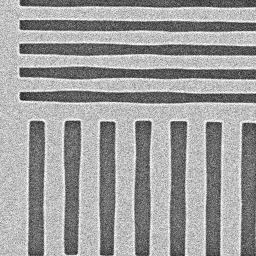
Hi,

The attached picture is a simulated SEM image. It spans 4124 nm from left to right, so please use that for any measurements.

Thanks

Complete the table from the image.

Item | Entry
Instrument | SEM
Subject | groups of lines, slits or small figures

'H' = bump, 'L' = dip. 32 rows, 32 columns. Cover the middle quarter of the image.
HHHHHHHHHHHHHHHHHHHHHHHHHHHHHHHH
LLLLLLLLLLLLLLLLLLLLLLLLLLLLLLLL
LLLLLLLLLLLLLLLLLLLLLLLLLLLLLLLL
LLLLLLLLLLLLLLLLLLLLLLLLLLLLLLLL
HHHHHHHHHHHHHHHHHHHHHHHHHHHHHHHH
HHHHHHHHHHHHHHHHHHHHHHHHHHHHHHHH
HHHHHHHHHHHHHHHHHHHHHHHHHHHHHHHH
LLLLLLLLLLLLLLLLLLLLLLLLLLLLLLLL
LLLLLLLLLLLLLLLLLLLLLLLLLLLLLLLL
LLLLLLLLLLLLLLLLLLLLLLLLLLLLLLLL
HHHHHHHHHHHHHHHHHHHHHHHHHHHHHHHH
HHHHHHHHHHHHHHHHHHHHHHHHHHHHHHHH
HHHHHHHHHHHHHHHHHHHHHHHHHHHHHHHH
HHHHHHHHHHHHHHHHHHHHHHHHHHHHHHHH
LLLLHHHHHLLLLHHHHHLLLLHHHHHLLLLH
LLLLHHHHHLLLLHHHHHLLLLHHHHLLLLLH
LLLLHHHHHLLLLHHHHHLLLLHHHHLLLLLH
LLLLHHHHHLLLLHHHHHLLLLHHHHLLLLLH
LLLLHHHHHLLLLHHHHHLLLLHHHHLLLLLH
LLLLHHHHHLLLLHHHHHLLLLHHHHLLLLLH
LLLLHHHHHLLLLHHHHHLLLLHHHHLLLLLH
LLLLHHHHHLLLLHHHHHLLLLHHHHLLLLLH
LLLLHHHHHLLLLHHHHHLLLLHHHHLLLLLH
LLLLHHHHHLLLLHHHHHLLLLHHHHLLLLLH
LLLLHHHHHLLLLHHHHHLLLLHHHHLLLLLH
LLLLHHHHHLLLLHHHHHLLLLHHHHLLLLLH
LLLLHHHHHLLLLHHHHHLLLLHHHHHLLLLH
LLLLHHHHHLLLLHHHHHLLLLHHHHHLLLLH
LLLLHHHHHLLLLHHHHHLLLLHHHHHLLLHH
LLLLHHHHHLLLLHHHHHLLLLHHHHHLLLHH
LLLLHHHHHLLLLHHHHLLLLLHHHHLLLLHH
LLLLHHHHHLLLLHHHHLLLLLHHHHLLLLHH